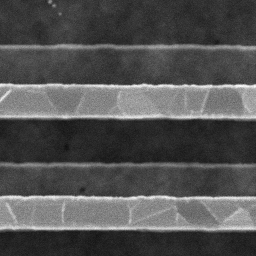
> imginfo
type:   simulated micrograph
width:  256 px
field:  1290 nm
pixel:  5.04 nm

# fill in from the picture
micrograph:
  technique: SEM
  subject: lines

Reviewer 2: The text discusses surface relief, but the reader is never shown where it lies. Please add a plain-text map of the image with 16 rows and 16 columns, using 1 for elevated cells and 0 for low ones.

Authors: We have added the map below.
0000000000000000
0000000000000000
0000000000000000
1111111111111111
1111111111111111
1111111111111111
1111111111111111
0000000000000000
0000000000000000
0000000000000000
1111111111111111
1111111111111111
1111111111111111
1111111111111111
0000000000000000
0000000000000000